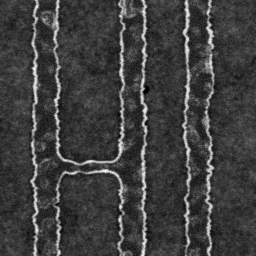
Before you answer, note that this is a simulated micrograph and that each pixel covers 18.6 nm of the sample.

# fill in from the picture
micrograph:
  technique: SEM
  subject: one or a few lines or trenches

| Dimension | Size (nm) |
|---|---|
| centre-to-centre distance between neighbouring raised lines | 1410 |